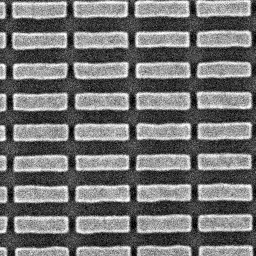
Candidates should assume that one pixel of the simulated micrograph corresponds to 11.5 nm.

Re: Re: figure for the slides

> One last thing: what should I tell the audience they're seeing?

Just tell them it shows wiring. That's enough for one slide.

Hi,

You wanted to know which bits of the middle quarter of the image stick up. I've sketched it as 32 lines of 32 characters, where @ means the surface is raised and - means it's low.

@--@@@@@@@@@@@@@--@@@@@@@@@@@@@-
@--@@@@@@@@@@@@@--@@@@@@@@@@@@@-
@--@@@@@@@@@@@@@--@@@@@@@@@@@@@-
-----@--------------------------
--------------------------------
--------------------------------
--------------------------------
-----@@@---@@@@----@@@@@@@@@@@@-
@--@@@@@@@@@@@@@--@@@@@@@@@@@@@-
@--@@@@@@@@@@@@@--@@@@@@@@@@@@@-
@--@@@@@@@@@@@@@--@@@@@@@@@@@@@-
--------------------------------
--------------------------------
--------------------------------
--------------------------------
@--@@@@@@@@@@@@@--@@@@@@@@@@@@@-
@--@@@@@@@@@@@@@--@@@@@@@@@@@@@-
@--@@@@@@@@@@@@@--@@@@@@@@@@@@@-
@--@@@@@@@@@@@@@---@--@@@@@@@@@-
--------------------------------
--------------------------------
--------------------------------
--------------------------------
@--@@@@@@@@@@@@@--@@@@@@@@@@@@@-
@--@@@@@@@@@@@@@--@@@@@@@@@@@@@-
@--@@@@@@@@@@@@@--@@@@@@@@@@@@@-
--------------------------------
--------------------------------
--------------------------------
--------------------------------
-------------@@@---@@@@@@@@@@@@-
@--@@@@@@@@@@@@@---@@@@@@@@@@@@-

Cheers